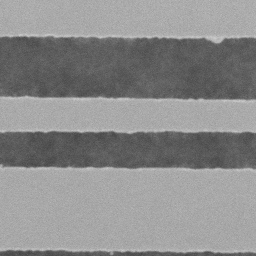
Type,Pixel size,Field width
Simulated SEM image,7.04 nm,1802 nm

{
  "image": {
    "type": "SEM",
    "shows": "lines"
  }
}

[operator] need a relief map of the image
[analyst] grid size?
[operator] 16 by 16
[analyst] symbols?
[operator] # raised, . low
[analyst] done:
################
################
................
................
................
................
################
################
................
................
#######.........
################
################
################
################
################